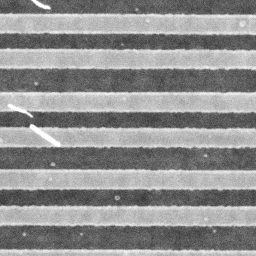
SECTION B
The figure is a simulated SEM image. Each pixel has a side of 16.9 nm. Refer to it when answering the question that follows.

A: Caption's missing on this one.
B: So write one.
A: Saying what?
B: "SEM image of lines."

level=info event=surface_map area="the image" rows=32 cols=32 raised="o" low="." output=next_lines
................................
................................
oooooooooooooooooooooooooooooooo
oooooooooooooooooooooooooooooooo
................................
................................
oooooooooooooooooooooooooooooooo
oooooooooooooooooooooooooooooooo
..o.oo.ooooooooooooooooooooooooo
................................
................................
................................
oooooooooooooooooooooooooooooooo
oooooooooooooooooooooooooooooooo
................................
................................
oooooooooooooooooooooooooooooooo
oooooooooooooooooooooooooooooooo
................................
................................
................................
oooooooooooooooooooooooooooooooo
oooooooooooooooooooooooooooooooo
oooooooooooooooooooooooooooooooo
................................
................................
oooooooooooooooooooooooooooooooo
oooooooooooooooooooooooooooooooo
................................
................................
................................
oooooooooooooooooooooooooooooooo